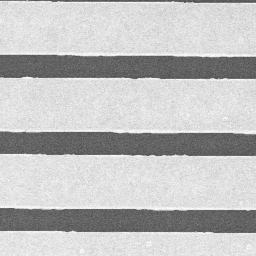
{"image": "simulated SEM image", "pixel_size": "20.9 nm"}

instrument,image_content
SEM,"lines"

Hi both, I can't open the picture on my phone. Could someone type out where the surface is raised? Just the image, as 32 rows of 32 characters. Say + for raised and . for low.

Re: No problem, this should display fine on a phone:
++++++++++++++++++++++++++++++++
++++++++++++++++++++++++++++++++
++++++++++++++++++++++++++++++++
++++++++++++++++++++++++++++++++
++++++++++++++++++++++++++++++++
++++++++++++++++++++++++++++++++
++++++++++++++++++++++++++++++++
................................
................................
................................
++++++++++++++++++++++++++++++++
++++++++++++++++++++++++++++++++
++++++++++++++++++++++++++++++++
++++++++++++++++++++++++++++++++
++++++++++++++++++++++++++++++++
++++++++++++++++++++++++++++++++
...................+++++++++++++
................................
................................
++++++++++++++++++++++++........
++++++++++++++++++++++++++++++++
++++++++++++++++++++++++++++++++
++++++++++++++++++++++++++++++++
++++++++++++++++++++++++++++++++
++++++++++++++++++++++++++++++++
++++++++++++++++++++++++++++++++
................................
................................
................................
++++++++++++++++++++++++++++++++
++++++++++++++++++++++++++++++++
++++++++++++++++++++++++++++++++